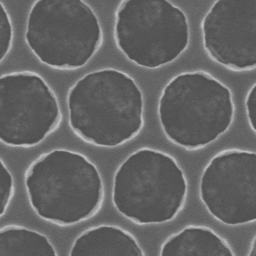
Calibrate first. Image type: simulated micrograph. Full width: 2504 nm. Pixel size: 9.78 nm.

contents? holes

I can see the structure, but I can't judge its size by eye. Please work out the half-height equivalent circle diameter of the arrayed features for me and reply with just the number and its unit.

716 nm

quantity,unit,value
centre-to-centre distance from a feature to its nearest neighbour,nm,854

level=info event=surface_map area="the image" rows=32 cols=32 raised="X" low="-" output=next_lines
XXXX-------XXXX------XXXXXX-----
-XXX--------XXX--------XXX------
-XXX--------XXX--------XXX------
-XX---------XXX--------XX-------
-XX----------XX--------XXX------
-XXX--------XXX--------XXX------
-XXX--------XXXX-------XXX------
XXXXX------XXXXX------XXXXX-----
XXXXXXXXXXXXXXXXXXXXXXXXXXXXXXXX
X---XXXXXXX-----XXXXXXX---XXXXXX
------XXXX-------XXXX------XXXXX
------XXX--------XXXX--------XX-
-------XX---------XX---------XX-
-------XX---------XX---------XX-
-------XX---------XX---------XX-
-------XX---------XX---------XX-
------XXXX-------XXXX-------XXXX
-----XXXXXX-----XXXXXX-----XXXXX
XXXXXXXXXXXXXXXXXXXXXXX-XXXXXXXX
XXXXXX----XXXXXX-----XXXXXX-----
XXXX-------XXXX-------XXXX------
-XXX--------XXX--------XXX------
-XX----------X---------XX-------
-XXX---------X---------XX-------
-XXX---------X---------XX-------
-XXX--------XX---------XXX------
XXXXX-------XXX-------XXXX------
XXXXXX----XXXXXXX----XXXXXXX---X
XXXXXXXXXXXX---XXXXXXXXXXXXXXXXX
-----XXXXX------XXXXXX-----XXXXX
------XXX--------XXXX-------XXXX
-------XX---------XX---------XX-